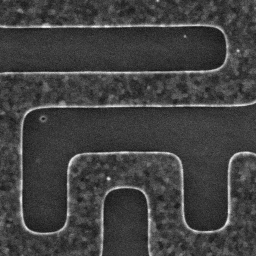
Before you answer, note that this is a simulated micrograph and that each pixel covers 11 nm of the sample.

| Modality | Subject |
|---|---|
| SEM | wiring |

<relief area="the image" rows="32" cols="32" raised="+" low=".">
++++++++++++++++++++++++++++++++
++++++++++++++++++++++++++++++++
++++++++++++++++++++++++++++++++
...........................+++++
............................++++
............................++++
............................++++
............................++++
...........................+++++
++++++++++++++++++++++++++++++++
++++++++++++++++++++++++++++++++
++++++++++++++++++++++++++++++++
++++++++++++++++++++++++++++++++
++++++..........................
+++.............................
+++.............................
+++.............................
+++.............................
+++.............................
+++......+++++++++++++.......+++
+++......++++++++++++++......+++
+++.....+++++++++++++++......+++
+++.....+++++++++++++++......+++
+++.....+++++++.+++++++......+++
+++.....+++++.....+++++......+++
+++.....+++++.....+++++......+++
+++.....+++++......++++.....++++
+++.....+++++......++++.....++++
+++.....+++++......+++++....++++
+++++++++++++......+++++++++++++
+++++++++++++......+++++++++++++
+++++++++++++......+++++++++++++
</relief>